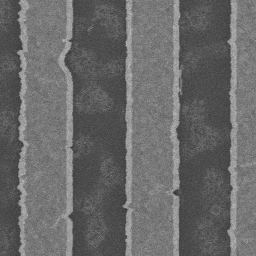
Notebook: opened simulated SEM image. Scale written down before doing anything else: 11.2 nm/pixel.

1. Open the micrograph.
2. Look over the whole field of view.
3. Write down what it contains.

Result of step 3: one or a few lines or trenches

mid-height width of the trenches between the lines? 654 nm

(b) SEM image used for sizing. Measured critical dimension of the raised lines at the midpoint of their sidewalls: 0.525 microns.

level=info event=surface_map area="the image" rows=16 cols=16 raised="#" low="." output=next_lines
.###....###....#
.###....###....#
.###....###....#
.###....###....#
.###....###....#
.###....###....#
.###....###....#
.###....###....#
.###....###....#
.###....###....#
.###....###....#
.###....###....#
.###....###....#
.###....###....#
.###....###....#
.###....###....#